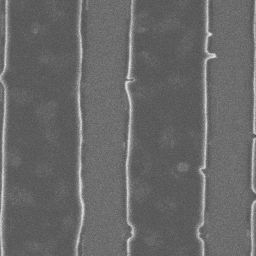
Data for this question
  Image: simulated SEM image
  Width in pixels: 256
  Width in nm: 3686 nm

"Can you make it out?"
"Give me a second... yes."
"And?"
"one or a few lines or trenches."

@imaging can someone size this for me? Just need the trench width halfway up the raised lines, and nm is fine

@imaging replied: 693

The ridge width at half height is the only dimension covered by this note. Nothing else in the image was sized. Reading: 1.11 micrometres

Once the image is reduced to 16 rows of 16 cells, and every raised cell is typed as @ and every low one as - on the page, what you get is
@@@@@---@@@@@---
@@@@@---@@@@@---
@@@@@---@@@@@---
@@@@@---@@@@@---
@@@@@---@@@@@---
@@@@@---@@@@@---
@@@@@---@@@@@---
@@@@@---@@@@@---
@@@@@---@@@@@---
@@@@@---@@@@@---
@@@@@---@@@@@---
@@@@@---@@@@@---
@@@@@---@@@@@---
@@@@@---@@@@@---
@@@@@---@@@@----
@@@@@---@@@@@---